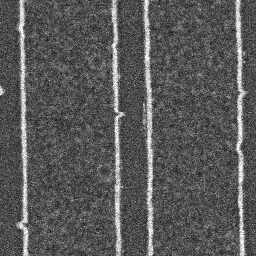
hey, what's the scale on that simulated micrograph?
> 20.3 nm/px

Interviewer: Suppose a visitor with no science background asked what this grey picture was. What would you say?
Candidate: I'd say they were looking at one or a few lines or trenches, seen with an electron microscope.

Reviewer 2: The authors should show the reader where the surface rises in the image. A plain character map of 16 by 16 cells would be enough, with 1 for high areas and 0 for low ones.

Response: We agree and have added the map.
0111111001111110
0111111001111110
0111111001111110
0111111001111110
0111111001111110
0111111001111110
0111111001111110
0111111001111110
0111111001111110
0011111001111110
0011111001111110
0011111001111110
0011111001111110
0011111001111110
0011111001111110
0011111001111110